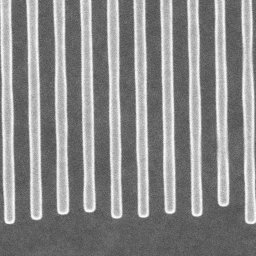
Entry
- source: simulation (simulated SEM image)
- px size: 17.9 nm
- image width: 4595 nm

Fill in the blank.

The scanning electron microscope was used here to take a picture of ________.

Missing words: groups of lines, slits or small figures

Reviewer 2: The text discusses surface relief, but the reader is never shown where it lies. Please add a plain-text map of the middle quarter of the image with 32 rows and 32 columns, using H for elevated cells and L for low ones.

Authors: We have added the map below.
LLLLLHHLLLLHHHLLLLHHLLLLLHHLLLLL
LLLLLHHLLLLHHHLLLLHHLLLLLHHLLLLL
LLLLLHHLLLLHHHLLLLHHLLLLLHHLLLLL
LLLLLHHLLLLLHHLLLLHHLLLLLHHLLLLL
LLLLLHHLLLLLHHLLLLHHLLLLLHHLLLLL
LLLLLHHLLLLLHHLLLLHHLLLLLHHLLLLL
LLLLLHHLLLLLHHLLLLHHLLLLLHHLLLLL
LLLLLHHLLLLLHHLLLLHHLLLLLHHLLLLL
LLLLLHHLLLLLHHLLLLHHLLLLLHHLLLLL
LLLLLHHLLLLLHHLLLLHHLLLLLHHLLLLL
LLLLLHHLLLLLHHLLLLHHLLLLLHHLLLLL
LLLLLHHLLLLLHHLLLLHHLLLLLHHLLLLL
LLLLLHHLLLLLHHLLLLHHLLLLLHHLLLLL
LLLLLHHLLLLLHHLLLLHHLLLLLHHLLLLL
HLLLLHHLLLLLHHLLLLHHHLLLLHHLLLLL
HLLLLHHLLLLLHHLLLLHHHLLLLHHLLLLL
HLLLLHHLLLLLHHLLLLHHHLLLLHHLLLLL
HLLLLHHLLLLLHHLLLLHHHLLLLHHLLLLL
HLLLLHHLLLLLHHLLLLHHHLLLLHHLLLLL
HLLLLHHLLLLLHHLLLLHHHLLLLHHLLLLL
LLLLLHHLLLLLHHLLLLHHHLLLLHHLLLLL
HLLLLHHLLLLLHHLLLLHHHLLLLHHLLLLL
HLLLLHHLLLLLHHLLLLHHHLLLLHHLLLLL
HLLLLHHLLLLLHHLLLLHHHLLLLHHLLLLL
HLLLLHHLLLLLHHLLLLHHHLLLLHHHLLLL
HLLLLHHLLLLLHHLLLLLHHLLLLHHHLLLL
HLLLLHHLLLLLHHLLLLLHHLLLLHHHLLLL
HLLLLHHLLLLLHHLLLLLHHLLLLHHHLLLL
HLLLLHHLLLLLHHLLLLLHHLLLLHHHLLLL
HLLLLHHLLLLLHHLLLLLHHLLLLHHHLLLL
HLLLLHHHLLLLHHLLLLLHHLLLLHHHLLLL
HLLLLHHHLLLLHHLLLLLHHLLLLHHHLLLL